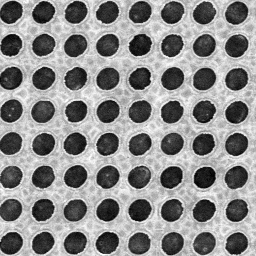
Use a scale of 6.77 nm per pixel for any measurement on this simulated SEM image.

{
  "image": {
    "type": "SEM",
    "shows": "a regular array of holes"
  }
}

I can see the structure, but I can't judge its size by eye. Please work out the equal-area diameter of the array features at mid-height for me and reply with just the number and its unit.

0.157 µm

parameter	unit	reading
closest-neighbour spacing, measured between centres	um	0.217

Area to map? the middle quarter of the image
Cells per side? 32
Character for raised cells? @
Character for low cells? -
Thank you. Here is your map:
@@@@@@@@@@@@@@@@@@@@@@@@@@@@@@@@
@@---@@@@----@@@@@---@@@@@---@@@
------@@------@@@-----@@@-----@@
------@@------@@------@@------@@
------@@------@@------@@------@@
-----@@@-----@@@@----@@@@----@@@
@@-@@@@@@@--@@@@@@--@@@@@@-@@@@@
@@@@@@@@@@@@@@@@@@@@@@@@@@@@@@@@
@@@@@@@@@@@@@@@@@@@@@@@@@@@@@@@@
@@---@@@@@---@@@@@---@@@@@---@@@
@-----@@------@@@-----@@@-----@@
------@@------@@------@@------@@
------@@------@@------@@------@@
@----@@@@----@@@-----@@@@----@@@
@@--@@@@@---@@@@@---@@@@@---@@@@
@@@@@@@@@@@@@@@@@@@@@@@@@@@@@@@@
@@@@@@@@@@@@@@@@@@@@@@@@@@@@@@@@
@@--@@@@@@---@@@@@@--@@@@@---@@@
@----@@@@-----@@@-----@@@-----@@
------@@------@@------@@------@@
------@@------@@------@@------@@
-----@@@-----@@@-----@@@-----@@@
@---@@@@@---@@@@@---@@@@@---@@@@
@@@@@@@@@@@@@@@@@@@@@@@@@@@@@@@@
@@@@@@@@@@@@@@@@@@@@@@@@@@@@@@@@
@@--@@@@@@--@@@@@@@-@@@@@@@-@@@@
@-----@@@-----@@@-----@@@-----@@
------@@------@@------@@------@@
------@@------@@------@@------@@
-----@@@------@@-----@@@-----@@@
@---@@@@@----@@@@---@@@@@---@@@@
@@@@@@@@@@@@@@@@@@@@@@@@@@@@@@@@